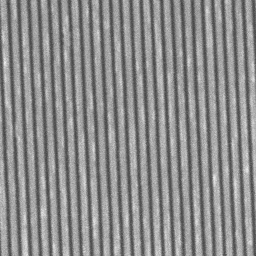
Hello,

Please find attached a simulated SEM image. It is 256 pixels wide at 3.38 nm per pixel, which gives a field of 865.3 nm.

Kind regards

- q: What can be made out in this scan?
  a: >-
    parallel lines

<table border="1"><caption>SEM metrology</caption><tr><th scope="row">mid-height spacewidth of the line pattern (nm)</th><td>14.8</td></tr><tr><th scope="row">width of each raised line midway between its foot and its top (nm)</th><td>21.1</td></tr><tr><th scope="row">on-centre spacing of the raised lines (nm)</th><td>34.5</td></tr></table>